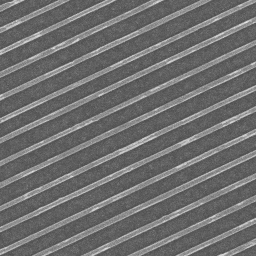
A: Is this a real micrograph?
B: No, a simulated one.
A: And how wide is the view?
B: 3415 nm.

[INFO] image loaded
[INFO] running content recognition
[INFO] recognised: parallel lines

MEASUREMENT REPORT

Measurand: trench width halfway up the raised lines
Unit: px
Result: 15.1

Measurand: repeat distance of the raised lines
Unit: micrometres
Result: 0.267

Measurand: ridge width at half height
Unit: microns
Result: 0.0663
